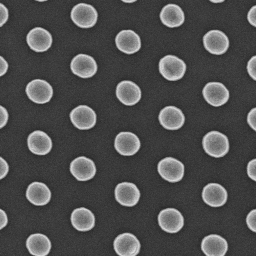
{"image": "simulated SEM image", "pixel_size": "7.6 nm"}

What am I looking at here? a regular array of raised bodies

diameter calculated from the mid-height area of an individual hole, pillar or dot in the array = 0.183 microns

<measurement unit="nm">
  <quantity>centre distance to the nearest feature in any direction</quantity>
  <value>384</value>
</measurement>